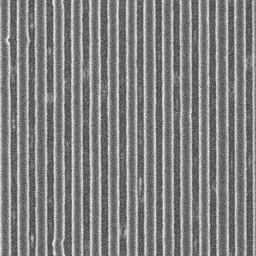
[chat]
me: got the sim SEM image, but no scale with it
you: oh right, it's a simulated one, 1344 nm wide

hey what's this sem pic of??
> parallel lines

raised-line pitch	0.0952	microns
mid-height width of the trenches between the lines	41.4	nm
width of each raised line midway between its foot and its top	10.5	px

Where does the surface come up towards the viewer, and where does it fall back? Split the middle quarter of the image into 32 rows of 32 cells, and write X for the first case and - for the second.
--XX---XX--XX---XX--XXX--XX--XXX
--XX---XX--XX---XX--XXX--XX--XXX
--XX---XX--XX---XX--XXX--XX--XXX
--XX---XX--XX---XX--XXX--XX--XXX
--XX---XX--XX---XX--XXX--XX--XXX
--XX---XX--XX---XX--XXX--XX--XXX
--XX---XX--XX---XX--XXX--XX--XXX
--XX---XX--XX---XX--XXX--XX--XXX
--XX---XX--XX---XX--XXX--XX--XXX
--XXX--XX--XX---XX--XXX--XX--XXX
--XXX--XX--XX---XX--XXX--XX--XXX
--XXX--XX--XX---XX--XXX--XX--XXX
--XXX--XX--XX---XX--XXX--XX--XXX
--XXX--XX--XX---XX--XXX--XX--XXX
--XXX--XX--XX---XX--XXX--XX--XXX
--XXX--XX--XX---XX--XXX--XX--XXX
--XXX--XX--XX---XX--XXX--XX--XXX
--XXX--XX--XX---XX--XXX--XX--XXX
--XXX--XX--XXX--XX--XXX--XX--XXX
--XXX--XX--XXX--XX--XXX--XX--XXX
--XXX--XX--XX---XX--XXX--XX--XXX
--XXX--XX--XXX--XX--XXX--XX--XXX
--XXX--XX--XXX--XX--XXX--XX--XXX
--XXX--XX--XXX--XX--XXX--XX--XXX
--XXX--XX--XXX--XX--XXX--XX--XXX
--XXX--XX--XXX--XX--XXX--XX--XXX
--XXX--XX--XXX--XX--XXX--XX--XXX
--XXX--XX--XXX--XX--XXX--XX--XXX
--XXX--XX--XXX--XX--XXX--XX--XXX
--XXX--XX--XXX--XX--XXX--XX--XXX
--XXX--XX--XXX--XX--XXX--XX--XXX
--XXX--XX--XXX--XX--XXX--XX--XXX